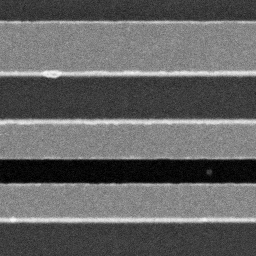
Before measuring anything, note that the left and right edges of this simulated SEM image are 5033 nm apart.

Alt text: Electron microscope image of lines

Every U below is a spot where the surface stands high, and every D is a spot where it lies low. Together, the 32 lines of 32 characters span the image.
DDDDDDDDDDDDDDDDDDDDDDDDDDDDDDDD
DDDDDDDDDDDDDDDDDDDDDDDDDDDDDDDD
DDDDDDDDDDDDDDDDDDDDDDDDDDDDDDDD
UUUUUUUUUUUUUUUUUUUUUUUUUUUUUUUU
UUUUUUUUUUUUUUUUUUUUUUUUUUUUUUUU
UUUUUUUUUUUUUUUUUUUUUUUUUUUUUUUU
UUUUUUUUUUUUUUUUUUUUUUUUUUUUUUUU
UUUUUUUUUUUUUUUUUUUUUUUUUUUUUUUU
UUUUUUUUUUUUUUUUUUUUUUUUUUUUUUUU
DDDDDDUDDDDDDDDDDDDDDDDDDDDDDDDD
DDDDDDDDDDDDDDDDDDDDDDDDDDDDDDDD
DDDDDDDDDDDDDDDDDDDDDDDDDDDDDDDD
DDDDDDDDDDDDDDDDDDDDDDDDDDDDDDDD
DDDDDDDDDDDDDDDDDDDDDDDDDDDDDDDD
DDDDDDDDDDDDDDDDDDDDDDDDDDDDDDDD
UUUUUUUUUUUUUUUUUUUUUUUUUUUUUUUU
UUUUUUUUUUUUUUUUUUUUUUUUUUUUUUUU
UUUUUUUUUUUUUUUUUUUUUUUUUUUUUUUU
UUUUUUUUUUUUUUUUUUUUUUUUUUUUUUUU
UUUUUUUUUUUUUUUUUUUUUUUUUUUUUUUU
DDDDDDDDDDDDDDDDDDDDDDDDDDDDDDDD
DDDDDDDDDDDDDDDDDDDDDDDDDDDDDDDD
DDDDDDDDDDDDDDDDDDDDDDDDDDDDDDDD
UUUUUUUUUUUUUUUUUUUUUUUUUUUUUUUU
UUUUUUUUUUUUUUUUUUUUUUUUUUUUUUUU
UUUUUUUUUUUUUUUUUUUUUUUUUUUUUUUU
UUUUUUUUUUUUUUUUUUUUUUUUUUUUUUUU
DUDDDDDDDDDDDDDDDDDDDDDDDDDDDDDD
DDDDDDDDDDDDDDDDDDDDDDDDDDDDDDDD
DDDDDDDDDDDDDDDDDDDDDDDDDDDDDDDD
DDDDDDDDDDDDDDDDDDDDDDDDDDDDDDDD
DDDDDDDDDDDDDDDDDDDDDDDDDDDDDDDD